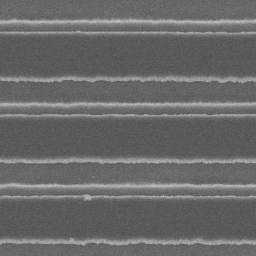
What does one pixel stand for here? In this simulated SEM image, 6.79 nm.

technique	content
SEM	lines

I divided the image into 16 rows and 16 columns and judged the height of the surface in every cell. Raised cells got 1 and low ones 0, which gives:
0000000000000000
0000000000000000
1111111111111111
1111111111111111
1111111111111111
0000000000000000
0000000000000000
1111111111111111
1111111111111111
1111111111111111
0000000000000000
0000000000000000
1111111111111111
1111111111111111
1111111111111111
0000000000000000